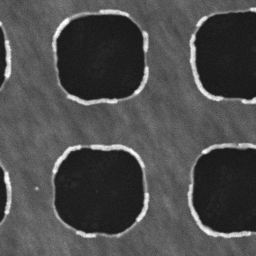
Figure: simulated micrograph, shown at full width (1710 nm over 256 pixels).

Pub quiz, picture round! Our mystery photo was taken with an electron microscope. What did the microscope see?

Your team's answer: holes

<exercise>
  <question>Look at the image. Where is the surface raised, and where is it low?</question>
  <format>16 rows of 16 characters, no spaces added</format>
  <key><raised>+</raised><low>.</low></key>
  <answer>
++++++++++++++++
++++....+++++...
++++.....+++....
++++.....+++....
++++.....+++....
++++.....++++...
++++++++++++++++
++++++++++++++++
++++++++++++++++
+++++...+++++...
++++.....+++....
+++......+++....
+++......+++....
++++.....+++....
+++++...++++++.+
++++++++++++++++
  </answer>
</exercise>